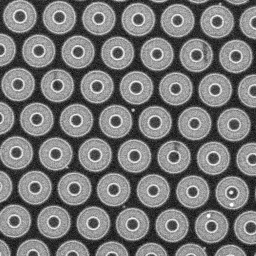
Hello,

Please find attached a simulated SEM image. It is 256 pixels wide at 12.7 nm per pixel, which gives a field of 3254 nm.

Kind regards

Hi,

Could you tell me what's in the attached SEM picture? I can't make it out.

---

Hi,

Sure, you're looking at an array of small figures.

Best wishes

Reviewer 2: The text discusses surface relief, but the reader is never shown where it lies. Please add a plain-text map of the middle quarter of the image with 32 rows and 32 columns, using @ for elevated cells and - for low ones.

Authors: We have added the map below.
@@---@@@@@@----@@@@@@-----@@@@--
@@@@@@@@@@@@@@@@@@@@@@@@@@@@@@@@
-@@@@@----@@@@@@----@@@@@@@--@@@
--@@@------@@@@------@@@@------@
--@@@--@@---@@---@@---@@-------@
--@@---@@@--@@--@@@@--@@---@@---
--@@@--@@@--@@--@@@@--@@--@@@---
-@@@@-------@@@--@@---@@---@@---
-@@@@@-----@@@@------@@@@------@
@@@@@@@--@@@@@@@@---@@@@@@----@@
@@--@@@@@@@@@@@@@@@@@@@@@@@@@@@@
------@@@@-----@@@@@@----@@@@@@-
-------@@@------@@@@------@@@@--
--@@@--@@---@@---@@---@@--@@@---
--@@@--@@--@@@---@@--@@@---@@--@
--@@---@@---@@---@@--@@@--@@@--@
------@@@@------@@@-------@@@---
@----@@@@@@----@@@@@-----@@@@@--
@@@@@@@@@@@@@@@@@@@@@@@@@@@@@@@@
@@@@@@----@@@@@@---@@@@@@@@-@@@@
-@@@@------@@@@-----@@@@@-----@@
--@@---@@--@@@---@---@@@-------@
--@@--@@@---@@--@@@--@@@--@@@--@
--@@--@@@---@@--@@@---@@--@@@--@
-@@@-------@@@---@---@@@--@@@--@
@@@@@-----@@@@@------@@@-------@
@@@@@@@--@@@@@@@---@@@@@@-----@@
@@-@@@@@@@@@@@@@@@@@@@@@@@@@@@@@
-----@@@@@-----@@@@@----@@@@@@@-
------@@@-------@@@------@@@@---
-@@@--@@@--@@@--@@@--@@---@@@---
-@@@--@@---@@@--@@---@@@--@@---@